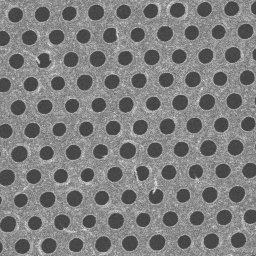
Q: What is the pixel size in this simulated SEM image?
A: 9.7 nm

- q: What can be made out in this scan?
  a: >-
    a regular array of holes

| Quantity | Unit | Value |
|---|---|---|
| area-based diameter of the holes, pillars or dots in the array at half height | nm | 145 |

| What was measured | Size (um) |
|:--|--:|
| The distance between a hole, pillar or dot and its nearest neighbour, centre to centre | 0.257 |